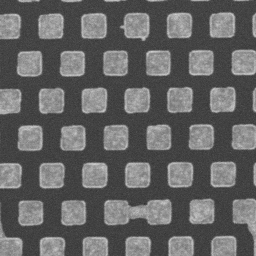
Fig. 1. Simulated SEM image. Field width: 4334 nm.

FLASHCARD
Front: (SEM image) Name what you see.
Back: a regular array of raised bodies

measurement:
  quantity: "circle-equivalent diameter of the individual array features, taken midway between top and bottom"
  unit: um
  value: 0.442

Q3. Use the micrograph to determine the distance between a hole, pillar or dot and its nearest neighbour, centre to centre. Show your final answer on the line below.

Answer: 0.721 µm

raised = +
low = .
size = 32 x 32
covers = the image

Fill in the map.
................................
................................
++...+++..+++...+++..+++..+++...
++...+++..+++...++...+++..+++...
++...+++..+++...++...+++...++...
................................
........++....+....++...++...+++
..+++...+++..+++..+++...+++..+++
..+++...+++..+++..+++...+++..+++
................................
................................
++...+++..+++...++...+++..+++...
++...+++..+++...+++..+++..+++...
++...+++..+++...+++..+++..+++...
................................
................................
..+++...+++..+++..+++...+++..+++
..+++...+++..+++..+++...+++..+++
...++...++...+++...++...++....++
................................
......++...++...++....++...++...
+++..+++..+++...+++..+++..+++...
+++..+++..+++...+++..+++..+++...
................................
................................
...++...+++..+++..+++...+++..+++
..+++...+++..++++++++...+++..+++
..+++...+++..+++..+++...+++..+++
...............................+
+...............................
+++..+++..+++...+++..+++...++...
+++..+++..+++...+++..+++...++...